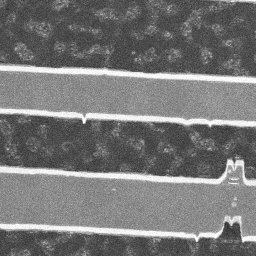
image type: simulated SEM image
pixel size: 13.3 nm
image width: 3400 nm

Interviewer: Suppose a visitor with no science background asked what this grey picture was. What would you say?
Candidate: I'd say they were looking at one or a few lines or trenches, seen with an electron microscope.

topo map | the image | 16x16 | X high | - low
----------------
----------------
----------------
----------------
XXXXXX----------
XXXXXXXXXXXXXXXX
XXXXXXXXXXXXXXXX
-----------XXXXX
----------------
----------------
--------------X-
XXXXXXXXXXXXXXXX
XXXXXXXXXXXXXXXX
XXXXXXXXXXXXXXXX
--------XXXXXX-X
----------------